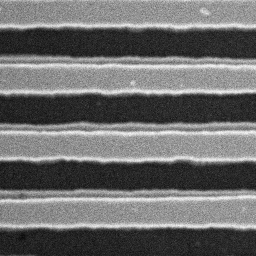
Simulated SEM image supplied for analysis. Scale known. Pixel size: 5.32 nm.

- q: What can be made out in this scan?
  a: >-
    lines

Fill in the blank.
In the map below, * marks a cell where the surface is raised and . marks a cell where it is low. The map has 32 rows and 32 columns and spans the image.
********************************
********************************
********************************
..**.................***......**
................................
................................
................................
********************************
********************************
********************************
********************************
********************************
................................
................................
................................
.........**.....*.........******
********************************
********************************
********************************
********************************
................................
................................
................................
................................
********************************
********************************
********************************
********************************
.......*......................**
................................
................................
................................